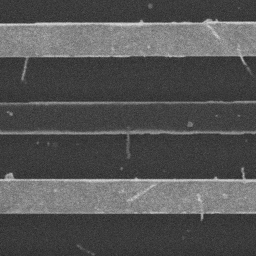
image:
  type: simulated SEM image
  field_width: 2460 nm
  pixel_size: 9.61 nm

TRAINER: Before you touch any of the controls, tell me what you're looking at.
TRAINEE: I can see lines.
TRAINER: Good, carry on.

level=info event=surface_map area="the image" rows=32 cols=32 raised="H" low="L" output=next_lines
LLLLLLLLLLLLLLLLLLLLLLLLLLLLLLLL
LLLLLLLLLLLLLLLLLLLLLLLLLLLLLLLL
LLLLLLLLLLLLLLLLLLLLLLLLLLLLLLLL
HHHHHHHHHHHHHHHHHHHHHHHHHHHHHHHH
HHHHHHHHHHHHHHHHHHHHHHHHHHHHHHHH
HHHHHHHHHHHHHHHHHHHHHHHHHHHHHHHH
HHHHHHHHHHHHHHHHHHHHHHHHHHHHHHHH
LLLLLLLLLLLLLLLLLLLLLLLLLLLLLLLL
LLLLLLLLLLLLLLLLLLLLLLLLLLLLLLLL
LLLLLLLLLLLLLLLLLLLLLLLLLLLLLLLL
LLLLLLLLLLLLLLLLLLLLLLLLLLLLLLLL
LLLLLLLLLLLLLLLLLLLLLLLLLLLLLLLL
LLLLLLLLLLLLLLLLLLLLLLLLLLLLLLLL
HHHHHHHHHHHHHHHHHHHHHHHHHHHHHHHH
HHHHHHHHHHHHHHHHHHHHHHHHHHHHHHHH
HHHHHHHHHHHHHHHHHHHHHHHHHHHHHHHH
HHHHHLLHHHHHHHLHHLLLLHHHHHHHHHHH
LLLLLLLLLLLLLLLLLLLLLLLLLLLLLLLL
LLLLLLLLLLLLLLLLLLLLLLLLLLLLLLLL
LLLLLLLLLLLLLLLLLLLLLLLLLLLLLLLL
LLLLLLLLLLLLLLLLLLLLLLLLLLLLLLLL
LLLLLLLLLLLLLLLLLLLLLLLLLLLLLLLL
HHHHHHHHHHHHHHHHHHHHHHHHHHHHHHHL
HHHHHHHHHHHHHHHHHHHHHHHHHHHHHHHH
HHHHHHHHHHHHHHHHHHHHHHHHHHHHHHHH
HHHHHHHHHHHHHHHHHHHHHHHHHHHHHHHH
HHHHHHHHHHHHHHHHHHHHHHHHHHHHHHHH
LLLLLLLLLLLLLLLLLLLLLLLLLLLLLLLL
LLLLLLLLLLLLLLLLLLLLLLLLLLLLLLLL
LLLLLLLLLLLLLLLLLLLLLLLLLLLLLLLL
LLLLLLLLLLLLLLLLLLLLLLLLLLLLLLLL
LLLLLLLLLLLLLLLLLLLLLLLLLLLLLLLL